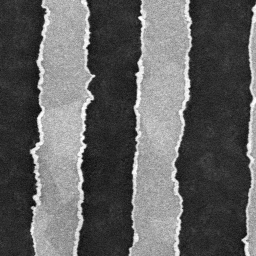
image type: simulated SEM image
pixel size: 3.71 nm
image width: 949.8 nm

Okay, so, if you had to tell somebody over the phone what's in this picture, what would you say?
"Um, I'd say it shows one or a few lines or trenches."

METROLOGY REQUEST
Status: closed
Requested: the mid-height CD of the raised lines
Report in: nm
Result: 173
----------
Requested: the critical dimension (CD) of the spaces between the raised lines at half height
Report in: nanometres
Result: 207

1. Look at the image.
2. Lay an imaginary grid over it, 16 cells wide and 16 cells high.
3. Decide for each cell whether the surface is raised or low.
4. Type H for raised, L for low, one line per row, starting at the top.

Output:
LLLHHLLLLHHHLLLL
LLLHHLLLLHHHLLLL
LLLHHLLLLHHHLLLL
LLHHHLLLLHHHLLLL
LLHHHHLLLHHHLLLL
LLHHHHLLLHHHLLLL
LLLHHLLLHHHHLLLL
LLHHHLLLLHHLLLLL
LLHHHLLLLHHLLLLL
LLHHHLLLHHHLLLLL
LLHHHLLLHHHLLLLL
LLHHHLLLHHHLLLLL
LLHHHLLLHHHLLLLL
LLHHHLLLHHHLLLLH
LLHHHLLLHHHLLLLH
LLHHHLLLHHHLLLLH